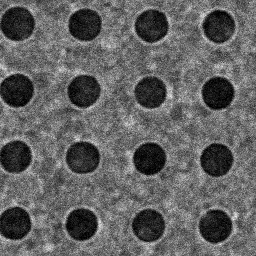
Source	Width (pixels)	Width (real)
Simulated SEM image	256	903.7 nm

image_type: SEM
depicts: a regular array of holes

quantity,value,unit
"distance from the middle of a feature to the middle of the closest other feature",234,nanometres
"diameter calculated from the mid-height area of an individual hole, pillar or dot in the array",125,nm